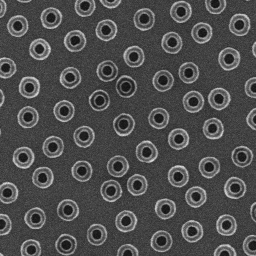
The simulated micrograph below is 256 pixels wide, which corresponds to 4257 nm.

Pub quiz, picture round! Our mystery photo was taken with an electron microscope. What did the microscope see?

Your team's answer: a regular array of ring-shaped raised bodies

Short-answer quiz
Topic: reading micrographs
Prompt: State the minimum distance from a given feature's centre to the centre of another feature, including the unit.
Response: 0.528 micrometres